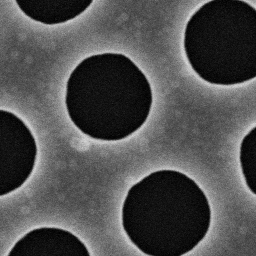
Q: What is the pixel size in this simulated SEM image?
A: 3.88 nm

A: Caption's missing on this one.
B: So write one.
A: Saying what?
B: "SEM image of holes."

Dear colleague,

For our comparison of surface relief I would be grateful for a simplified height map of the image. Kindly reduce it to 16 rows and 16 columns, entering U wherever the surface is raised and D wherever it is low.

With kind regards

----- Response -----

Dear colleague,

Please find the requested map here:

UDDDDUUUUUUUUDDD
UUUUUUUUUUUUDDDD
UUUUUUUUUUUUDDDD
UUUUUUDDUUUUDDDD
UUUUUDDDDUUUDDDD
UUUUDDDDDUUUUUUU
UUUUDDDDDUUUUUUU
DUUUUDDDDUUUUUUU
DDUUUUDDUUUUUUUD
DDUUUUUUUUUUUUUD
DDUUUUUUUUUUUUUD
DUUUUUUUDDDDUUUD
UUUUUUUUDDDDDUUU
UUUUUUUUDDDDDUUU
UUDDUUUUDDDDDUUU
UDDDDUUUUDDDUUUU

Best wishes